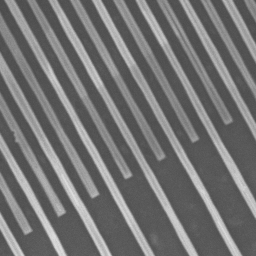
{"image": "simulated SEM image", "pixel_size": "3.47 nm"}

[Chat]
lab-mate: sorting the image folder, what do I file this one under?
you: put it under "parallel lines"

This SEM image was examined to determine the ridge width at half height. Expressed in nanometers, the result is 24.7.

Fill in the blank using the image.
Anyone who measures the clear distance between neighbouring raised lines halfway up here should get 12.4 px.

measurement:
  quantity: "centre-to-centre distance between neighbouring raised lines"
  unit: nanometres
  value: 66.2